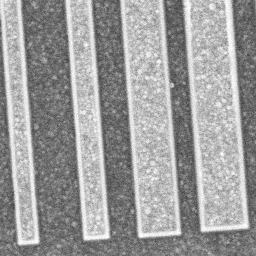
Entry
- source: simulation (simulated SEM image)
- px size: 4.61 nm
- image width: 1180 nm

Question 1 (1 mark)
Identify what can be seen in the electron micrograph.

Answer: one or a few lines or trenches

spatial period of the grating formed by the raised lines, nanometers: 303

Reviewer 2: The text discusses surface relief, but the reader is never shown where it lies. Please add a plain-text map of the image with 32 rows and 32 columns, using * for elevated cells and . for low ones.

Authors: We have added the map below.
**......***....*****...******...
**......***....*****...******...
***......**....*****...******...
***......**.....****...******...
***......**.....****....*****...
.**......***....****....*****...
.**......***....*****...*****...
.**......***....*****...*****...
.**......***....*****...*****...
.**......***....*****...*****...
.**......***....*****...*****...
.**......***....*****...******..
.**......***....*****...******..
.**......***....*****...******..
.**......***....*****...******..
.***......**....*****...******..
.***......**.....****...******..
.***......**.....****....*****..
..**......***....****....*****..
..**......***....*****...*****..
..**......***....*****...*****..
..**......***....*****...*****..
..**......***....*****...*****..
..**......***....*****...*****..
..**......***....*****...******.
..**......***....*****...******.
..**......***....*****...******.
..**......***....*****...******.
..***......**....*****....**....
..***......**...................
................................
................................